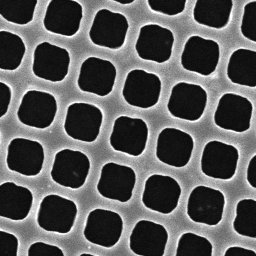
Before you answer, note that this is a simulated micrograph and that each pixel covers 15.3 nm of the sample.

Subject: a regular array of holes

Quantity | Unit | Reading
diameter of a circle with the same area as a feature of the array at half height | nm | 593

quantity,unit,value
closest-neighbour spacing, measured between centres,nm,719